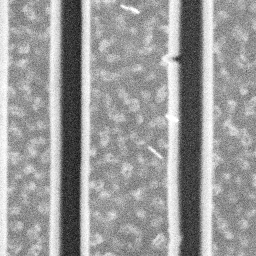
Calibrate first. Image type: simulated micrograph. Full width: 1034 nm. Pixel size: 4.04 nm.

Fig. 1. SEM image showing one or a few lines or trenches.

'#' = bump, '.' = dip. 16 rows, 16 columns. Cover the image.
###..######..###
####.######..###
####.######..###
###..######..###
###..######..###
###..######..###
###..######..###
###..######..###
###..######..###
###..######..###
###..######..###
###..######..###
###..######..###
###..######..###
###..######..###
###..######..###